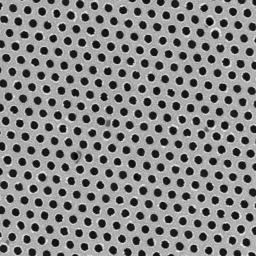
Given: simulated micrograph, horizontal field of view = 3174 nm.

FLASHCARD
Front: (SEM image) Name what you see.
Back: a regular array of holes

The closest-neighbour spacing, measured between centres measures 0.176 micrometres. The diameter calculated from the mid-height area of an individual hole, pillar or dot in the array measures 105 nm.